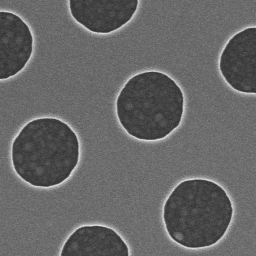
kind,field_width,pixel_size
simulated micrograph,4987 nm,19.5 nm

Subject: holes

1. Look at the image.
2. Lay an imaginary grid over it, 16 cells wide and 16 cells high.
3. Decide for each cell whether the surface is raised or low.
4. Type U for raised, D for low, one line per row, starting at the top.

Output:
UUUUDDDDDUUUUUUU
DDUUUDDDUUUUUUUU
DDUUUUUUUUUUUUDD
DDUUUUUUUUUUUUDD
DUUUUUUUUDUUUUDD
UUUUUUUUDDDUUUUD
UUUUUUUDDDDUUUUU
UUDDUUUDDDDUUUUU
UDDDDUUUDDUUUUUU
UDDDDUUUUUUUUUUU
UDDDDUUUUUUUUUUU
UUDDUUUUUUUDDUUU
UUUUUUUUUUDDDDUU
UUUUUUUUUUDDDDUU
UUUUUDDUUUUDDDUU
UUUUDDDDUUUUUUUU